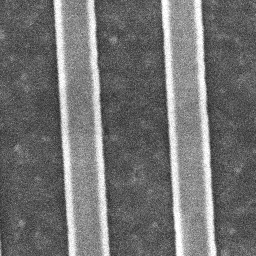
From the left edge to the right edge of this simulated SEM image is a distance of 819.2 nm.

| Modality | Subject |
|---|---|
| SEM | one or a few lines or trenches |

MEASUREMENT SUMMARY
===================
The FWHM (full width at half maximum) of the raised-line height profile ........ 111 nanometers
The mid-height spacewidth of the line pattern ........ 231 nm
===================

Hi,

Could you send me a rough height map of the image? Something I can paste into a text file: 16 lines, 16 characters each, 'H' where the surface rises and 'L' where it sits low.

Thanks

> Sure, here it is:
LLLLHHLLLLHHLLLL
LLLLHHLLLLHHLLLL
LLLLHHLLLLHHHLLL
LLLLHHLLLLHHHLLL
LLLLHHLLLLLHHLLL
LLLLHHLLLLLHHLLL
LLLLHHLLLLLHHLLL
LLLLHHLLLLLHHLLL
LLLLHHLLLLLHHLLL
LLLLHHLLLLLHHLLL
LLLLHHLLLLLHHLLL
LLLLHHLLLLLHHLLL
LLLLHHLLLLLHHLLL
LLLLHHLLLLLHHLLL
LLLLHHHLLLLHHLLL
LLLLHHHLLLLHHLLL